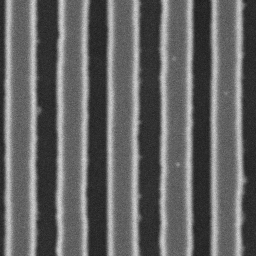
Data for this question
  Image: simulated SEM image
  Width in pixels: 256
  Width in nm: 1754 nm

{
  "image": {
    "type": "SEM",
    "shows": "lines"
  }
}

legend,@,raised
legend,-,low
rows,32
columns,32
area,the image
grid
-@@@---@@@@---@@@---@@@@---@@@--
-@@@---@@@@---@@@---@@@@---@@@--
-@@@---@@@@---@@@---@@@@---@@@--
-@@@---@@@@---@@@---@@@@--@@@@--
-@@@---@@@@---@@@---@@@@--@@@@--
-@@@---@@@@---@@@---@@@@---@@@--
-@@@---@@@@---@@@---@@@@---@@@--
-@@@---@@@@---@@@---@@@@---@@@--
-@@@---@@@@---@@@---@@@@---@@@--
-@@@---@@@@---@@@---@@@@---@@@--
-@@@---@@@@---@@@---@@@@--@@@@--
-@@@---@@@@---@@@---@@@@--@@@@--
-@@@---@@@@---@@@---@@@@--@@@@--
-@@@---@@@@---@@@---@@@@--@@@@--
-@@@---@@@@---@@@---@@@@--@@@@--
-@@@---@@@@---@@@---@@@@--@@@@--
-@@@---@@@@---@@@---@@@@--@@@@--
-@@@@--@@@@---@@@---@@@@--@@@@--
-@@@---@@@@---@@@---@@@@--@@@@--
-@@@---@@@@---@@@---@@@@--@@@@--
-@@@---@@@@---@@@---@@@@--@@@@--
-@@@---@@@@---@@@---@@@@--@@@@--
-@@@---@@@@---@@@---@@@@--@@@@--
-@@@---@@@@---@@@---@@@@--@@@@--
-@@@---@@@@---@@@---@@@@--@@@@--
-@@@---@@@@---@@@---@@@@---@@@--
-@@@---@@@@---@@@---@@@@---@@@--
-@@@---@@@@---@@@---@@@@--@@@@--
-@@@---@@@@---@@@---@@@@---@@@--
-@@@---@@@@---@@@---@@@@--@@@@--
-@@@---@@@@---@@@---@@@@--@@@@--
-@@@---@@@@---@@@---@@@@--@@@@--